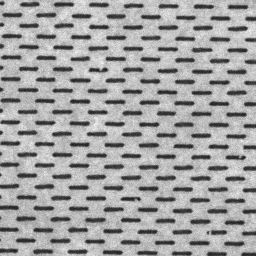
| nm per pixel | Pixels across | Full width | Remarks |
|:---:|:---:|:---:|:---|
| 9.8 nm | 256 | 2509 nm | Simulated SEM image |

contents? a regular array of holes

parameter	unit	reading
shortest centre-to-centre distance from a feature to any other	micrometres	0.194